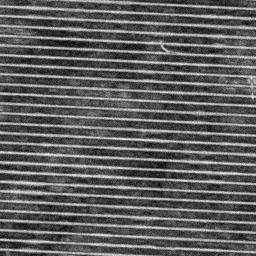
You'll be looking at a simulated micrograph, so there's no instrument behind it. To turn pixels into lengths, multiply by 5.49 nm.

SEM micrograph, parallel lines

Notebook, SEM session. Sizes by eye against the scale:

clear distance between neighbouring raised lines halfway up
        0.0425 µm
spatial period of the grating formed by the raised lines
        0.0533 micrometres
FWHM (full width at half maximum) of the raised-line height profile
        9.6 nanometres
